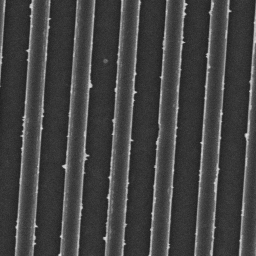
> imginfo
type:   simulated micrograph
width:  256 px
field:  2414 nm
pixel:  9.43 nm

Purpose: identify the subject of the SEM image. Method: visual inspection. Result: parallel lines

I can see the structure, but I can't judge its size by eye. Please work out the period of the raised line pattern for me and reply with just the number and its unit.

422 nm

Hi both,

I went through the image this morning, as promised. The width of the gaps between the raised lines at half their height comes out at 252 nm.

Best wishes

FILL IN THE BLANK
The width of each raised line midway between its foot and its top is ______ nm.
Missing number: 171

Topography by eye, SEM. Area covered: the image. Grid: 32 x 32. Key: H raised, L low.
HLLLHHLLLLHHLLLHHHLLLHHLLLHHHLLL
HLLLHHLLLLHHLLLHHLLLLHHLLLHHHLLL
LLLLHHLLLLHHLLLHHLLLLHHLLLHHLLLL
LLLLHHLLLHHHLLLHHLLLLHHLLLHHLLLL
LLLLHHLLLHHHLLLHHLLLHHHLLLHHLLLL
LLLLHHLLLHHHLLLHHLLLHHHLLLHHLLLL
LLLHHHLLLHHLLLLHHLLLHHHLLLHHLLLL
LLLHHHLLLHHLLLLHHLLLHHHLLLHHLLLL
LLLLHHLLLHHLLLLHHLLLHHHLLLHHLLLH
LLLHHHLLLHHLLLLHHLLLHHLLLLHHLLLH
LLLHHLLLLHHLLLLHHLLLHHLLLLHHLLLH
LLLHHLLLLHHLLLHHHLLLHHLLLLHHLLLH
LLLHHLLLLHHLLLHHHLLLHHLLLLHHLLLH
LLLHHLLLLHHLLLHHHLLLHHLLLLHHLLLH
LLLHHLLLLHHLLLHHLLLLHHLLLHHHLLLH
LLLHHLLLLHHLLLHHLLLLHHLLLHHHLLLH
LLLHHLLLLHHLLLHHLLLLHHLLLHHHLLLH
LLLHHLLLHHHLLLHHLLLLHHLLLHHHLLLH
LLLHHLLLHHHLLLHHLLLLHHLLLHHLLLLH
LLLHHLLLHHHLLLHHLLLLHHLLLHHLLLLH
LLLHHLLLHHHLLLHHLLLHHHLLLHHLLLLH
LLLHHLLLHHLLLLHHLLLHHHLLLHHLLLLH
LLLHHLLLHHLLLLHHLLLHHHLLLHHLLLLH
LLLHHLLLHHLLLLHHLLLHHHLLLHHLLLHH
LLHHHLLLHHLLLLHHLLLHHLLLLHHLLLHH
LLHHLLLLHHLLLLHHLLLHHLLLLHHLLLHH
LLHHLLLLHHLLLHHHLLLHHLLLLHHLLLHH
LLHHLLLLHHLLLHHHLLLHHLLLLHHLLLHH
LLHHLLLLHHLLLHHHLLLHHLLLLHHLLLHH
LLHHLLLLHHLLLHHHLLLHHLLLLHHLLLHH
LLHHLLLLHHLLLHHHLLLHHLLLHHHLLLHH
LLHHLLLLHHLLLHHLLLLHHLLLHHHLLLHH